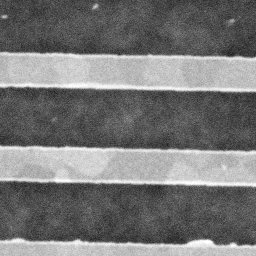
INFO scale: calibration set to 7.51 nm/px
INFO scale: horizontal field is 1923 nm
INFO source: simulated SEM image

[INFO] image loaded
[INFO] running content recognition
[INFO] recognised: lines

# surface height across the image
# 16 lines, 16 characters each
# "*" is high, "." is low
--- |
................
................
................
********.*......
****************
.........*******
................
................
................
****************
****************
.............***
................
................
................
****************